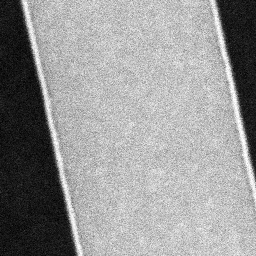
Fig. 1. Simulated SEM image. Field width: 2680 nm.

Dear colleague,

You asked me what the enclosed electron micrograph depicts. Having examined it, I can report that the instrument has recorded one or a few lines or trenches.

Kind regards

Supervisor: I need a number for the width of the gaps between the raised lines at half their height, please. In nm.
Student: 1910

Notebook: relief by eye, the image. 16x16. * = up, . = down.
**...........***
**............**
**............**
**............**
***...........**
***...........**
***............*
***............*
***............*
****...........*
****............
****............
****............
*****...........
*****...........
*****...........